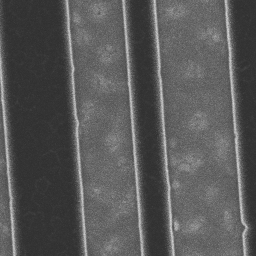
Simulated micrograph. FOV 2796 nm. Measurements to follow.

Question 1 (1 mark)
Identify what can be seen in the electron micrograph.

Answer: one or a few lines or trenches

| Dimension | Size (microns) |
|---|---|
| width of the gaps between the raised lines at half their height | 0.683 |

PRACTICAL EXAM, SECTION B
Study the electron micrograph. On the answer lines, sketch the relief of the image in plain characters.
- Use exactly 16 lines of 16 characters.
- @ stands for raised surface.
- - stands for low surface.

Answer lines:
@@@@----@@----@@
@@@@----@@----@@
@@@@----@@----@@
@@@@----@@----@@
@@@@@---@@----@@
@@@@@---@@----@@
@@@@@---@@-----@
@@@@@---@@-----@
@@@@@---@@-----@
@@@@@---@@-----@
@@@@@---@@-----@
-@@@@----@@----@
-@@@@----@@----@
-@@@@----@@----@
-@@@@----@@----@
-@@@@----@@----@